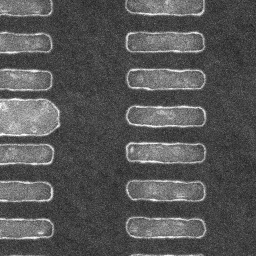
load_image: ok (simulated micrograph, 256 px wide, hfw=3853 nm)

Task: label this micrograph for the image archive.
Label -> holes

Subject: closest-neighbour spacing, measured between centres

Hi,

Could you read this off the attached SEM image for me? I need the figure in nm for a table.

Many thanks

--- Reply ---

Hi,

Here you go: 562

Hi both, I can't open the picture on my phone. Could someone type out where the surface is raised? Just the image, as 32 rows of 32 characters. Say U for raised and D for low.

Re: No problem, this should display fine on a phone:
DDDDDDUUUUUUUUUUDDDDDDDDDDUUUUUU
DDDDDDUUUUUUUUUUDDDDDDDDDUUUUUUU
UUUUUUUUUUUUUUUUUUUUUUUUUUUUUUUU
UUUUUUUUUUUUUUUUUUUUUUUUUUUUUUUU
DDDDDDUUUUUUUUUUDDDDDDDDDUUUUUUU
DDDDDDUUUUUUUUUUDDDDDDDDDUUUUUUU
DUUUUUUUUUUUUUUUUUUUUUUUUUUUUUUU
UUUUUUUUUUUUUUUUUUUUUUUUUUUUUUUU
UUUUUUUUUUUUUUUUUUUUUUUUUUUUUUUU
DDDDDDUUUUUUUUUUDDDDDDDDDUUUUUUU
DDDDDDUUUUUUUUUUDDDDDDDDDUUUUUUU
UUUUUUUUUUUUUUUUUUUUUUUUUUUUUUUU
DUUUUUUUUUUUUUUUUUUUUUUUUUUUUUUU
DDDDDDDUUUUUUUUUUDDDUUDDDUUUUUUU
DDDDDDDUUUUUUUUUDDDDDDDDDDUUUUUU
DDDDDDDUUUUUUUUUUDDDDDDDDUUUUUUU
DDDDDDUUUUUUUUUUUUUUUUUUUUUUUUUU
UUUUUUUUUUUUUUUUUUUUUUUUUUUUUUUU
DDDDDDUUUUUUUUUUDDDDDDDDDDUUUUUU
DDDDDDDUUUUUUUUUDDDDDDDDDDUUUUUU
UUUUUUUUUUUUUUUUUUUUUUUUUUUUUUUU
UUUUUUUUUUUUUUUUUUUUUUUUUUUUUUUU
UUUUUUUUUUUUUUUUUUUUUUUUUUUUUUUU
DDDDDDUUUUUUUUUUDDDDDDDDDUUUUUUU
DDDDDDUUUUUUUUUUDDDDDDDDDUUUUUUU
UUUUUUUUUUUUUUUUUUUUUUUUUUUUUUUU
UUUUUUUUUUUUUUUUUUUUUUUUUUUUUUUU
DDDUUUUUUUUUUUUUDDDDDDDUUUUUUUUU
DDDDDDUUUUUUUUUUDDDDDDDDDDUUUUUU
DDDDDDUUUUUUUUUUUDDDDDDDDUUUUUUU
UUUUUUUUUUUUUUUUUUUUUUUUUUUUUUUU
UUUUUUUUUUUUUUUUUUUUUUUUUUUUUUUU